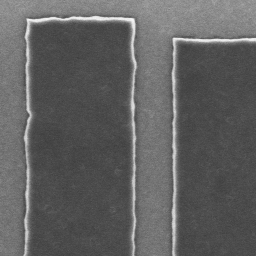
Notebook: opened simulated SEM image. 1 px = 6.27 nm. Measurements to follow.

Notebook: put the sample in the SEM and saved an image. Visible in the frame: one or a few lines or trenches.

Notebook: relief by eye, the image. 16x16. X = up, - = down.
----------------
--XXXXXX--------
--XXXXXX---XX--X
--XXXXXX---XXXXX
--XXXXXX---XXXXX
--XXXXXX---XXXXX
--XXXXXX---XXXXX
--XXXXXX---XXXXX
--XXXXXX---XXXXX
--XXXXXX---XXXXX
--XXXXXX---XXXXX
--XXXXXX---XXXXX
--XXXXXX---XXXXX
--XXXXXX---XXXXX
--XXXXXX---XXXXX
--XXXXXX---XXXXX